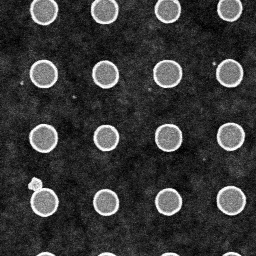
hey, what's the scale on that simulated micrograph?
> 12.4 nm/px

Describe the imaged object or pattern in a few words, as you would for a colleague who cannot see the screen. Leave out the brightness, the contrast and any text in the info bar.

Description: a regular array of raised bodies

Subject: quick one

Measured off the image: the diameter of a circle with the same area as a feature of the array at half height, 322 nm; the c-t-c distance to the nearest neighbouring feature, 767 nm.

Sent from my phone